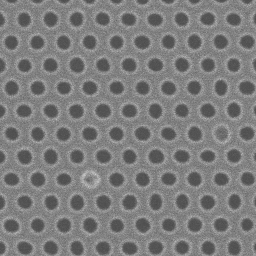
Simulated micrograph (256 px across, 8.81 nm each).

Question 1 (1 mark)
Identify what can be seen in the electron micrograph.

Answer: a regular array of holes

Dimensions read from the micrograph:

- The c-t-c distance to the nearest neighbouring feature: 228 nm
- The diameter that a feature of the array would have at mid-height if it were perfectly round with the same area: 14.3 pixels